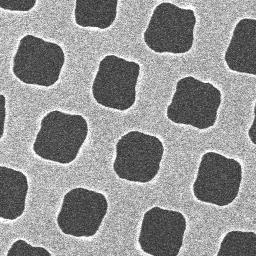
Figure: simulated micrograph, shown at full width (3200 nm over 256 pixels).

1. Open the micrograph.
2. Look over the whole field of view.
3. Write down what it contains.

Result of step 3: a regular array of holes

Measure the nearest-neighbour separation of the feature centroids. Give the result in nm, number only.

969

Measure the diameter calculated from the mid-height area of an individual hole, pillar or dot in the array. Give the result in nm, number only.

638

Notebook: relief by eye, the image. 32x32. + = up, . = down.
....+++++......+++++..++++++++++
+++++++++......++++.....++++++++
+++++++++.....+++++.....++++++..
++++++++++++.+++++......+++++...
+++.++++++++++++++......+++++...
++.....+++++++++++......+++++...
++......+++++++++++....+++++....
++......+++++...++++++++++++....
++......++++.....++++++++++++...
++.....+++++.....+++++++++++++++
++++...+++++.....+++++....++++++
++++++++++++.....+++++......++++
.+++++++++++.....++++.......++++
.+++++++++++++..+++++......+++++
.+++++....+++++++++++......+++++
.++++......++++++++++++....++++.
+++++......+++++..+++++++++++++.
++++.......++++.....+++++++++++.
++++......++++......++++++++++++
+++++.....++++......+++++...++++
++++++++++++++......+++++.....++
...+++++++++++......+++++.....++
...+++++++++++++...+++++......++
....+++++.++++++++++++++......++
...+++++.....+++++++++++......++
...+++++.....+++++++++++++..++++
...++++......+++++....++++++++++
+++++++......+++++.....+++++++++
+++++++.....++++++.....+++++++++
+++++++++..++++++......+++++....
++..+++++++++++++......+++++....
+.....++++++++++++....+++++.....